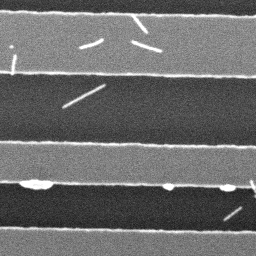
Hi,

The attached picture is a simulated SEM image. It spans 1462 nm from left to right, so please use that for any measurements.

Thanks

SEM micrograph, lines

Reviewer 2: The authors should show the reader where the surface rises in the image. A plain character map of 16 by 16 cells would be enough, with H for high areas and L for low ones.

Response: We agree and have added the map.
LLLLLLLLLLLLLLLL
HHHHHHHHHHHHHHHH
HHHHHHHHHHHHHHHH
HHHHHHHHHHHHHHHH
HHHHHHHHHHHHHHHH
LLLLLLLLLLLLLLLL
LLLLLLLLLLLLLLLL
LLLLLLLLLLLLLLLL
LLLLLLLLLLLLLLLL
HHHHHHHHHHHHHHHH
HHHHHHHHHHHHHHHH
LHHHHHHHHHHHHHHH
LLLLLLLLLLLLLLLL
LLLLLLLLLLLLLLLL
HHHHHHHHHHHHHHLH
HHHHHHHHHHHHHHHH